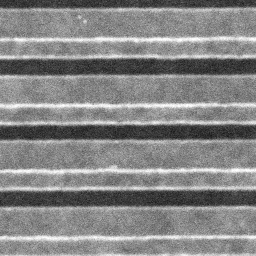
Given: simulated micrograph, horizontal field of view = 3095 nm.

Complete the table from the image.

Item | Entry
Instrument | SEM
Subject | lines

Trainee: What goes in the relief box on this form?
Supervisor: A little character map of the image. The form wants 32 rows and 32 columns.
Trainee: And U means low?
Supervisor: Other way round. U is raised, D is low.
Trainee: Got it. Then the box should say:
DDDDDDDDDDDDDDDDDDDDDDDDDDDDDDDD
UUUUUUUUUUUUUUUUUUUUUUUUUUUUUUUU
UUUUUUUUUUUUUUUUUUUUUUUUUUUUUUUU
UUUUUUUUUUUUUUUUUUUUUUUUUUUUUUUU
UUUUUUUUUUUUUUUUUUUUUUUUUUUUUUUU
UUUUUUUUUUUUUUUUUUUUUUUUUUUUUUUU
UUUUUUUUUUUUUUUUUUUUUUUUUUUUUUUU
DDDDDDDDDDDDDDDDDDDDDDDDDDDDDDDD
DDDDDDDDDDDDDDDDDDDDDDDDDDDDDDDD
DDDDDDDDDDDDDDDDDDDDDDDDDDDDDDDD
UUUUUUUUUUUUUUUUUUUUUUUUUUUUUUUU
UUUUUUUUUUUUUUUUUUUUUUUUUUUUUUUU
UUUUUUUUUUUUUUUUUUUUUUUUUUUUUUUU
UUUUUUUUUUUUUUUUUUUUUUUUUUUUUUUU
UUUUUUUUUUUUUUUUUUUUUUUUUUUUUUUU
DDDDDDDDDDDDDDDDDDDDDDDDDDDDDDDD
DDDDDDDDDDDDDDDDDDDDDDDDDDDDDDDD
DDDDDDDDDDDDDDDDDDDDDDDDDDDDDDDD
UUUUUUUUUUUUUUUUUUUUUUUUUUUUUUUU
UUUUUUUUUUUUUUUUUUUUUUUUUUUUUUUU
UUUUUUUUUUUUUUUUUUUUUUUUUUUUUUUU
UUUUUUUUUUUUUUUUUUUUUUUUUUUUUUUU
UUUUUUUUUUUUUUUUUUUUUUUUUUUUUUUU
UUUUUUUUUUUUUUUDUUUUUUUDDDDUUDDD
DDDDDDDDDDDDDDDDDDDDDDDDDDDDDDDD
DDDDDDDDDDDDDDDDDDDDDDDDDDDDDDDD
UUUUUUUUUUUUUUUUUUUUUUUUUUUUUUUU
UUUUUUUUUUUUUUUUUUUUUUUUUUUUUUUU
UUUUUUUUUUUUUUUUUUUUUUUUUUUUUUUU
UUUUUUUUUUUUUUUUUUUUUUUUUUUUUUUU
UUUUUUUUUUUUUUUUUUUUUUUUUUUUUUUU
UUUUUUUUUUUUUUUUUUUUUUUUUUUUUUUU